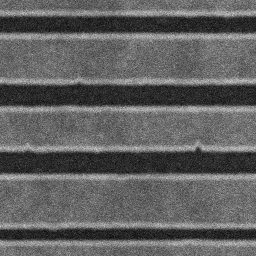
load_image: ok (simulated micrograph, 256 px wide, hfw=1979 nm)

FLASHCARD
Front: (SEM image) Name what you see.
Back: one or a few lines or trenches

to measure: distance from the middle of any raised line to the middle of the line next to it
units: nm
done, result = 548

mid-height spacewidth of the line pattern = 192 nanometres